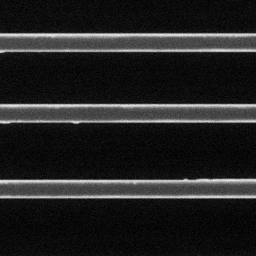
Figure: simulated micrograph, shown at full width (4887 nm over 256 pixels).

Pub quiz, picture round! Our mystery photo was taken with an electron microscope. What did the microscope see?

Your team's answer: lines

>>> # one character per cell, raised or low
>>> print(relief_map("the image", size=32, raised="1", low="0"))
00000000000000000000000000000000
00000000000000000000000000000000
00000000000000000000000000000000
00000000000000000000000000000000
11111111111111111111111111111111
11111111111111111111111111111111
00000000000000000000000000000000
00000000000000000000000000000000
00000000000000000000000000000000
00000000000000000000000000000000
00000000000000000000000000000000
00000000000000000000000000000000
00000000000000000000000000000000
11111111111111111111111111111111
11111111111111111111111111111111
00000000000000000000000000000000
00000000000000000000000000000000
00000000000000000000000000000000
00000000000000000000000000000000
00000000000000000000000000000000
00000000000000000000000000000000
00000000000000000000000000000000
00000000000000000000000000000000
11111111111111111111111111111111
11111111111111111111111111111111
00000000000000000000000000000000
00000000000000000000000000000000
00000000000000000000000000000000
00000000000000000000000000000000
00000000000000000000000000000000
00000000000000000000000000000000
00000000000000000000000000000000